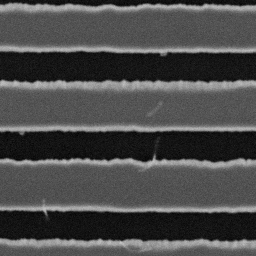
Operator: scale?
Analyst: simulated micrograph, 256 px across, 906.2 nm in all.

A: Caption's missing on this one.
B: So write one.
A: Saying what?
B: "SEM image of lines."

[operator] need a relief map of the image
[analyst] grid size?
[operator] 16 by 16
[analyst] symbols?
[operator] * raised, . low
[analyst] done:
****************
****************
****************
................
................
****************
****************
****************
................
................
****************
****************
****************
................
................
****************